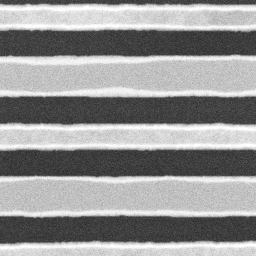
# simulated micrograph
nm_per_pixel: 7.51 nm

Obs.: lines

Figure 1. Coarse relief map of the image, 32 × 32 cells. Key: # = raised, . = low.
................................
################################
################################
##.#############################
................................
................................
................................
################################
################################
################################
################################
################################
................................
................................
................................
................................
################################
################################
##########...########.....######
................................
................................
................................
################################
################################
################################
################################
################################
................................
................................
................................
..........###.....#....#########
################################